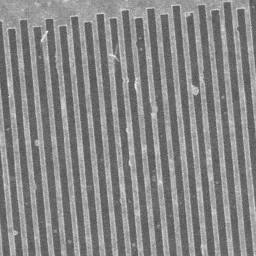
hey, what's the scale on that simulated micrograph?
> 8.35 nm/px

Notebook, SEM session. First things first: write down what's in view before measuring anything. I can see parallel lines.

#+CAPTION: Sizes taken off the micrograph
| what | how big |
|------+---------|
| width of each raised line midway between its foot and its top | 4.85 pixels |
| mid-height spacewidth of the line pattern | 0.0665 um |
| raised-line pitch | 106 nm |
